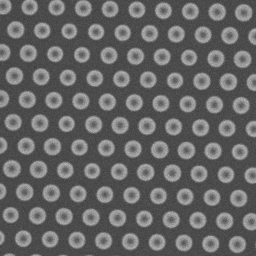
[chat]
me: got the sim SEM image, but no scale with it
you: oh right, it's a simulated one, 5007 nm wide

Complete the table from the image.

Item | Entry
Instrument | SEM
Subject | an array of small figures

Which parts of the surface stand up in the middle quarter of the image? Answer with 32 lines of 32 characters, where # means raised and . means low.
................................
................................
###...###....###....##.....##...
###...####..####...####...####..
###...###....###...####...####..
..............#.....##....###...
................................
...##...........................
..####...####...###....###....##
..####...####...####..####...###
...###...####...###...####...###
.................#.....##.....##
................................
##....###....##.................
##....###...####...###....###...
##...####...####...####...###...
##....###...####...####...###...
...........................#....
................................
...##....###....##.....##.......
..####...###...####...####...###
..####...###...####...####...###
...##....###....###...####...###
..............................#.
................................
##....##....###....###....##....
##...####...####..####...####...
##...####...####..####...####...
.............##....###...####...
................................
................................
..###....###....##....###....##.